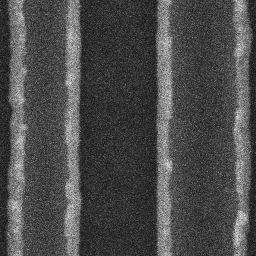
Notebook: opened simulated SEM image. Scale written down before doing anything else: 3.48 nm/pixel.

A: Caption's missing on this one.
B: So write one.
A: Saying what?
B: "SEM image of one or a few lines or trenches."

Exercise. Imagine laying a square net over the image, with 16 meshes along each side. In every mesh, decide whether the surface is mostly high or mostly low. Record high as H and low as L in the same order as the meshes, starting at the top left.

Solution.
LHHHHLLLLLHHHHHL
LHHHHLLLLLHHHHHL
LHHHHLLLLLHHHHHL
LHHHHLLLLLHHHHHL
LHHHHLLLLLHHHHHL
LHHHHLLLLLHHHHHL
LHHHHLLLLLHHHHHL
LHHHHLLLLLHHHHHL
LHHHHLLLLLHHHHHL
LHHHHLLLLLHHHHHL
LHHHHLLLLLHHHHHL
LHHHHLLLLLHHHHHL
LHHHHLLLLLHHHHHL
LHHHHLLLLLHHHHHL
LHHHHLLLLLHHHHHL
LHHHHLLLLLHHHHHL